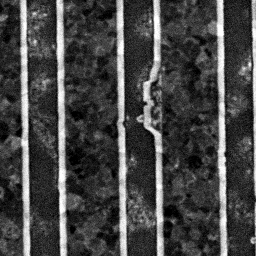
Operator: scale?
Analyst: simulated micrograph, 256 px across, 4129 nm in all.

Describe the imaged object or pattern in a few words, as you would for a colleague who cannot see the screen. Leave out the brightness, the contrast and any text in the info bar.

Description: one or a few lines or trenches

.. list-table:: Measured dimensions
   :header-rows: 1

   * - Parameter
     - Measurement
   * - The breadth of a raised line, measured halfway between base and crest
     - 63.2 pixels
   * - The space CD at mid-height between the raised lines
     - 568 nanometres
